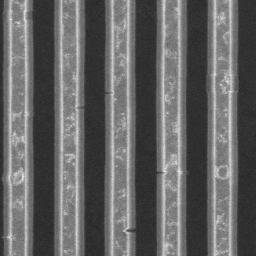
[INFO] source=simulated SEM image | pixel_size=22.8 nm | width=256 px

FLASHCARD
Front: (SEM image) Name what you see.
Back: parallel lines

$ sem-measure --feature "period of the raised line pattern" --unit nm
1160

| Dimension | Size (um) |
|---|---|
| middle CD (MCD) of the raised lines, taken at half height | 0.469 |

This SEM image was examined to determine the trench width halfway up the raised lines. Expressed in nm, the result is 683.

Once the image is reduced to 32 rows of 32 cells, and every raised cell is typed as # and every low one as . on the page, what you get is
.###...###....##....###....##...
.##....###....##....###....##...
.##....###....##....###....##...
.##....###....##....###....##...
.##....###....##....###....##...
.###...###....##....###....##...
.###...###....##....###....##...
.###...###....##....###....##...
.###...###....##....###....##...
.###...###....##....###...###...
.###...###....##....###...###...
.###...###....##....###...###...
.###...###....##....###....##...
.###...###....##....###....##...
.###...###....##....###....##...
.###....##....##....###....##...
.###...###....##....###....##...
.###...###....##....###....##...
.###...###....##....###....##...
.###...###....##....###....##...
.###...###....##....###....##...
.###...###....##....###....##...
.###...###....##....###....##...
.###...###....##....###....##...
.###...###....##....###....##...
.###...###....##....###....##...
.###...###....##....###....##...
.###...###....##....###....##...
.###...###....##....###....##...
.###...###....##....###....##...
.###...###....##....###....##...
.###...###....##....###....##...